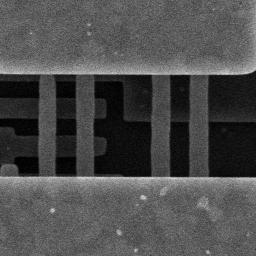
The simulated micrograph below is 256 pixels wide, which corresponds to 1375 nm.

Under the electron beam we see wiring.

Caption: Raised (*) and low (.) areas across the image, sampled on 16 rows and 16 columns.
****************
****************
****************
****************
****************
................
................
................
................
................
................
****************
****************
****************
****************
****************